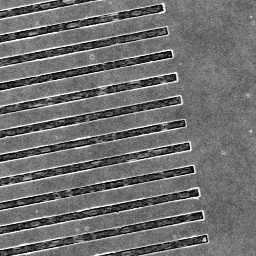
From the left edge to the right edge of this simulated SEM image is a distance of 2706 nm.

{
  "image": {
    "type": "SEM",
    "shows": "parallel lines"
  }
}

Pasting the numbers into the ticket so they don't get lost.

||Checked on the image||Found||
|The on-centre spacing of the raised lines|248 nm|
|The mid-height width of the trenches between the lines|84.3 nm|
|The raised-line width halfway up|169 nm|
